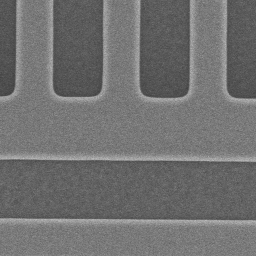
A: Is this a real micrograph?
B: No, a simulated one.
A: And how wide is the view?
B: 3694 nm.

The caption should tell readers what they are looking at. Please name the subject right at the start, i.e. groups of lines, slits or small figures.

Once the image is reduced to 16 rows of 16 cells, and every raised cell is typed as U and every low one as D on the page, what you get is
DUUDDDUUUDDDUUDD
DUUDDDUUUDDDUUDD
DUUDDDUUUDDDUUDD
DUUDDDUUUDDDUUDD
DUUDDDUUUDDDUUDD
DUUDDDUUUDDDUUDD
UUUUUUUUUUUUUUUU
UUUUUUUUUUUUUUUU
UUUUUUUUUUUUUUUU
UUUUUUUUUUUUUUUU
DDDDDDDDDDDDDDDD
DDDDDDDDDDDDDDDD
DDDDDDDDDDDDDDDD
DDDDDDDDDDDDDDDD
UUUUUUUUUUUUUUUU
UUUUUUUUUUUUUUUU